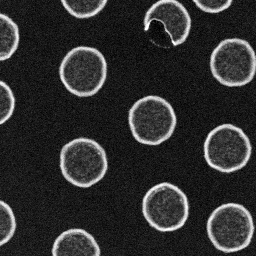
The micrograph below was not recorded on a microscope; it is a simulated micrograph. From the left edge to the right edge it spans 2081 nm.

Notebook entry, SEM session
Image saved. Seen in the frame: raised bodies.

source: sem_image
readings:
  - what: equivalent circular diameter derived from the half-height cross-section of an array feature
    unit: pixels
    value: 44.6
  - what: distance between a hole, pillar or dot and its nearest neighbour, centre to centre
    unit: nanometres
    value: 653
